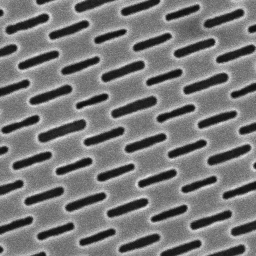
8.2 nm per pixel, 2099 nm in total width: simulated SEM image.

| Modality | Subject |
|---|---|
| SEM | a regular array of holes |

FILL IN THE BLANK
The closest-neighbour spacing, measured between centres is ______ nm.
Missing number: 306